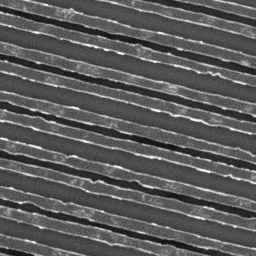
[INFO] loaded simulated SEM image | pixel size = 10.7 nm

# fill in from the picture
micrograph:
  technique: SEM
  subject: parallel lines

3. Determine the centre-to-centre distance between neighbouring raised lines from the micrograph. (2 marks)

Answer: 23.3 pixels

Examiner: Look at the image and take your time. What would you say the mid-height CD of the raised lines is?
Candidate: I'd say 116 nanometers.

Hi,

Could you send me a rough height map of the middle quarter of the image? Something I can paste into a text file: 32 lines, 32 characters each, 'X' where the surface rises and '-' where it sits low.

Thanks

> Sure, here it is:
XXXXXXXX--------------------XXXX
XXXXXXXXXXXXX-------------------
-----XXXXXXXXXXX----------------
X---------XXXXXXXXXX------------
XXXXX---------XXXXXXXXXX--------
XXXXXXXXX---------XXXXXXXXXXX---
--XXXXXXXXXXXX---------XXXXXXXXX
-------XXXXXXXXXXX---------XXXXX
------------XXXXXXXXXX---------X
----------------XXXXXXXXXXX-----
-------------------XXXXXXXXXXX--
XXXXX------------------XXXXXXXXX
XXXXXXXX-------------------XXXXX
XXXXXXXXXXXX-------------------X
-----XXXXXXXXXXX----------------
----------XXXXXXXXXX------------
XXXXX--------XXXXXXXXXXXX-------
XXXXXXXXX--------XXXXXXXXXXXX---
-XXXXXXXXXXX---------XXXXXXXXXXX
------XXXXXXXXXXXX------XXXXXXXX
---------XXXXXXXXXXXXX------XXXX
--------------XXXXXXXXXXXX------
------------------XXXXXXXXXXX---
XXXX--------------------XXXXXXXX
XXXXXXX--------------------XXXXX
-XXXXXXXXXXX-------------------X
-----XXXXXXXXXXX----------------
---------XXXXXXXXX--------------
XXXXX-------XXXXXXXXXXX---------
XXXXXXXXXX---------XXXXXXXXX----
--XXXXXXXXXXX--------XXXXXXXXXXX
-----XXXXXXXXXXXX---------XXXXXX